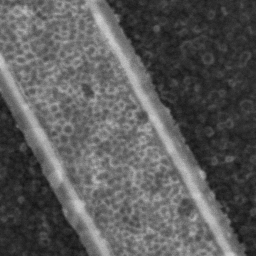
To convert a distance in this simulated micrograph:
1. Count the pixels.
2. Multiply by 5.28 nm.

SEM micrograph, one or a few lines or trenches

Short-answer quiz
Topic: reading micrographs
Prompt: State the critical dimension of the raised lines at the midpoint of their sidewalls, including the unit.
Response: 0.57 um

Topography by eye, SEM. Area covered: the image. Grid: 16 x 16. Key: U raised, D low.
UUUUUUDDDDDDDDDD
UUUUUUDDDDDDDDDD
UUUUUUUDDDDDDDDD
UUUUUUUUDDDDDDDD
UUUUUUUUDDDDDDDD
DUUUUUUUUDDDDDDD
DUUUUUUUUDDDDDDD
DDUUUUUUUUDDDDDD
DDDUUUUUUUDDDDDD
DDDUUUUUUUUDDDDD
DDDDUUUUUUUDDDDD
DDDDUUUUUUUUDDDD
DDDDDUUUUUUUDDDD
DDDDDUUUUUUUUDDD
DDDDDDUUUUUUUUDD
DDDDDDUUUUUUUUDD